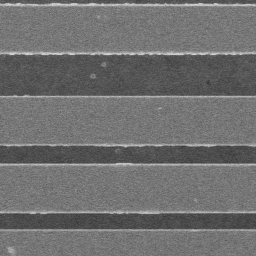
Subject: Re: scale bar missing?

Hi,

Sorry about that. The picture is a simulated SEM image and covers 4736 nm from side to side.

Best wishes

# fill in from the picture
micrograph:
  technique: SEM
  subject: lines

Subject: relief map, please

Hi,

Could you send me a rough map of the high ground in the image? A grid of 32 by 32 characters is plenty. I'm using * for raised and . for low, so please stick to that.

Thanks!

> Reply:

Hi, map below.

................................
********************************
********************************
********************************
********************************
********************************
********************************
................................
................................
................................
................................
................................
********************************
********************************
********************************
********************************
********************************
********************************
................................
................................
................................
********************************
********************************
********************************
********************************
********************************
********************************
................................
................................
********************************
********************************
********************************